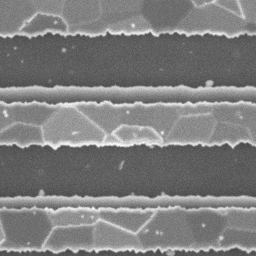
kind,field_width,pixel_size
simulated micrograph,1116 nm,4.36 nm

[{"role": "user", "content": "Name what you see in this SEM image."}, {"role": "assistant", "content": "lines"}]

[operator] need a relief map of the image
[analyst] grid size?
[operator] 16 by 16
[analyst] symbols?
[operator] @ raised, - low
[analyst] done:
@@@@@@@@@@@@@@@@
@@@@@@@@@@@@@@@@
----------------
----------------
----------------
----------------
@@@-@@@-@@@@@@@@
@@@@@@@@@@@@@@@@
@@@@@@@@@@@@@@@@
----------------
----------------
----------------
----------------
@@@@@@@@@@@@@@@@
@@@@@@@@@@@@@@@@
@@@@@@@@@@@@@@@@